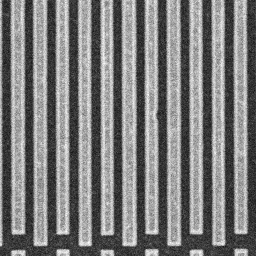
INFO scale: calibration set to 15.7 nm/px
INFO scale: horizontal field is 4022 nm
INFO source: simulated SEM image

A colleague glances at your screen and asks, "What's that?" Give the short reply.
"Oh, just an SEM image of parallel lines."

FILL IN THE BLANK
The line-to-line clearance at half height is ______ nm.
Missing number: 187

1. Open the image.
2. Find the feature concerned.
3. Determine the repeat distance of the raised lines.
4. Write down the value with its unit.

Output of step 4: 350 nanometres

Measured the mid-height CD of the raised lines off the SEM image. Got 0.161 micrometres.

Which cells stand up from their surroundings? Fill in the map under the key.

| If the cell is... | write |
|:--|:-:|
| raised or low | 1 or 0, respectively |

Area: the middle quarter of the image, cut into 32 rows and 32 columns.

10001100001100011100011000111000
10001100001100011100011000111000
10001100001100011100011000111000
10001100001100011100011000111000
10001100001100011100011000111000
10001100001100011100011000111000
10001100001100011100011000111000
10001100001100011100011000111000
10001100001100011100011000111000
10001100001100011100011000111000
10001100001100011100011000111000
10001100001100011100011000111000
10001100001100011100011000111000
10001100001100011100011000111000
10001100001100011100011000111000
10001100001100011100011000111000
10001100001100011100011000111000
10001100001100011100011000111000
10001100001100011100011000111000
10001100001100011100011000111000
10001100001100011100011000111000
10001100001100011100011000111000
10001100001100011100011000111000
10001100001100011100011000111000
10001100001100011100011000111000
10001100001100011100011000111000
10001100001100011100011000111000
10001100001100011100011000111000
10001100001100011100011000111000
10001100001100011100011000111000
10001100001100011100011000111000
10001100001100011100011000111000